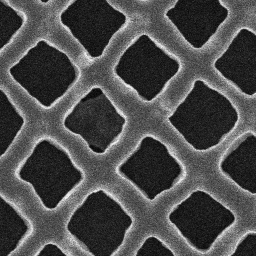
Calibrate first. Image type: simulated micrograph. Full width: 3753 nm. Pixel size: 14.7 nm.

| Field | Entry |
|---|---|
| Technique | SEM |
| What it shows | holes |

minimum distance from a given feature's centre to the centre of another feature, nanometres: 1060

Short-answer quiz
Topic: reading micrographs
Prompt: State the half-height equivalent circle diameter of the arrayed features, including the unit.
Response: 822 nm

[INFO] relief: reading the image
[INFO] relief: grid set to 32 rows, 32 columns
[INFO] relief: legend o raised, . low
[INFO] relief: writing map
.oooooooo.....oooooooo......oooo
..oooooo.......oooooo.......oooo
...ooooo........ooooo.......oooo
..ooooooo......ooooooo.....ooooo
..ooooooo.....ooooooooo...oooo..
.oooo.oooo...oooo..ooooo..ooo...
ooo.....ooo..ooo.....ooooooo....
ooo......oooooo.......ooooo.....
o.........oooo........ooooo.....
oo........ooooo.......oooooo....
oo.......ooooooo.....ooo..ooo...
ooo.....ooo..oooo...oooo...ooo..
.oooo..ooo....oooo.oooo......ooo
..ooooooo.....oooooooo.......ooo
...ooooo.......oooooo.........oo
...ooooo.......ooooooo.......ooo
..ooooooo......ooooooo.......ooo
..ooooooooo...oooo..ooo.....oo..
.ooo....ooo..oooo....ooo..ooo...
oooo.....ooooooo.....ooooooo....
ooo......oooooo.......oooooo....
oo........ooooo........ooooo....
ooo.......oooooo......ooooooo...
oooo.....oooooooo....ooooooooo..
ooooo...ooo..ooooo..oooo..oooooo
.oooo..ooo.....ooooooo......oooo
..ooooooo.......oooooo.......ooo
...oooooo.......ooooo........ooo
....oooo........oooooo......oooo
...oooooo.......ooooooo....oooo.
..oooooooo.....ooo..oooo...ooo..
.oooo...ooo...ooo.....ooooooo...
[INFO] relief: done